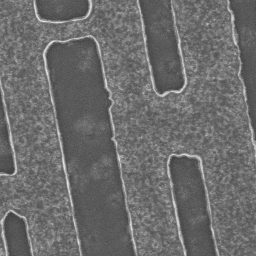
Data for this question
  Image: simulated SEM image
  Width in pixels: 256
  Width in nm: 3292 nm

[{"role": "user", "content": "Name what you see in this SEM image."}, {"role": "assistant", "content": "one or a few lines or trenches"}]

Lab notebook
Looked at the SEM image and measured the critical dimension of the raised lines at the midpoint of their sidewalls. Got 609 nm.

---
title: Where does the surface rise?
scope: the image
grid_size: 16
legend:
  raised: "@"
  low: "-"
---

@@----@@@--@@@--
@@@@@@@@@--@@@@-
@@@@--@@@--@@@@-
@@@---@@@--@@@@-
@@@----@@---@@@-
@@@----@@@-@@@@-
@@@----@@@@@@@@-
@@@----@@@@@@@@@
-@@@---@@@@@@@@@
-@@@---@@@@@@@@@
-@@@----@@@--@@@
@@@@----@@@--@@@
@@@@----@@@--@@@
-@@@@---@@@--@@@
--@@@---@@@--@@@
--@@@---@@@---@@